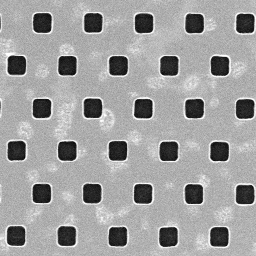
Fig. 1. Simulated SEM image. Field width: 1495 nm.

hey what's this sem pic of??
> a regular array of holes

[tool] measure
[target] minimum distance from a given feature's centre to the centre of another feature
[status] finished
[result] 289 nm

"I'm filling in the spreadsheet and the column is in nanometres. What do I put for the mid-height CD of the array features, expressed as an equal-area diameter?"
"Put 124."